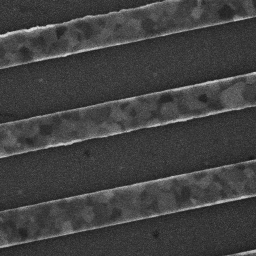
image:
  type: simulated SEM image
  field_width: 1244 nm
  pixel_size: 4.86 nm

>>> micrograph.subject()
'one or a few lines or trenches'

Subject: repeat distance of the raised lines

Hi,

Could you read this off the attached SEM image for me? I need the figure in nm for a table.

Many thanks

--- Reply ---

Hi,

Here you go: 424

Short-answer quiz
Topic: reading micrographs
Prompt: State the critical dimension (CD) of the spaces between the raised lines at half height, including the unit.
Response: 259 nm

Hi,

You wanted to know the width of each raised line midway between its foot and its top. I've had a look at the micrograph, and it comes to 161 nanometres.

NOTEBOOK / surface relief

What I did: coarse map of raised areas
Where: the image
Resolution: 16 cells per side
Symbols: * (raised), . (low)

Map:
.........*******
....**********..
*********.......
****............
................
...........*****
......**********
.***********....
*******.........
**..............
.............***
........********
....***********.
**********......
*****...........
................